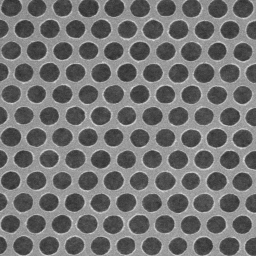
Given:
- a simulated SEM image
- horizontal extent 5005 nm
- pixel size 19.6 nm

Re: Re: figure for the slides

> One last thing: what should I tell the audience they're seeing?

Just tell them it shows a regular array of holes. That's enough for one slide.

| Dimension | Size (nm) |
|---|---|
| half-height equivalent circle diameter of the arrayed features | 381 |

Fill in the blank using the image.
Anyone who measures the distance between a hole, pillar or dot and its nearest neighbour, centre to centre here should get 488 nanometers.